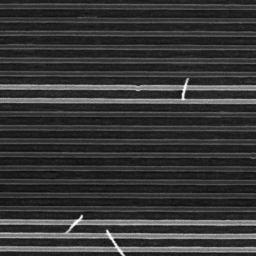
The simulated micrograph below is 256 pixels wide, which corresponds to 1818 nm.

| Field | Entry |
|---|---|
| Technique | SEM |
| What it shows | parallel lines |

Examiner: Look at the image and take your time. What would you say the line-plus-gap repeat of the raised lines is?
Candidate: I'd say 95.7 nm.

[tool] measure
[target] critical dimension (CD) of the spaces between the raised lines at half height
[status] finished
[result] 63.9 nm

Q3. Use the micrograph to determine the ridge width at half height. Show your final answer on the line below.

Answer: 0.032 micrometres